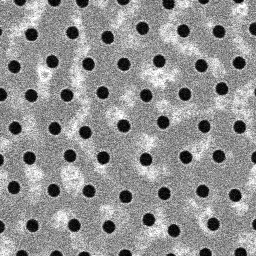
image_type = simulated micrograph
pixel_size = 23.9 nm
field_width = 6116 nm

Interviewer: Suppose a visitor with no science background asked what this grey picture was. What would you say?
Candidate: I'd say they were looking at a regular array of holes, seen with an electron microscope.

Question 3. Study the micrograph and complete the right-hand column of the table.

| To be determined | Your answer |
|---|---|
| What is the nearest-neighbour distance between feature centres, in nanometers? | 792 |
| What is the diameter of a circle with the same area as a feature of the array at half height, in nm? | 322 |